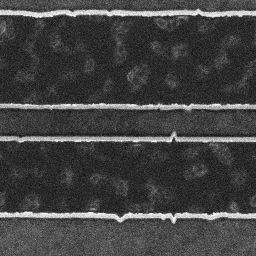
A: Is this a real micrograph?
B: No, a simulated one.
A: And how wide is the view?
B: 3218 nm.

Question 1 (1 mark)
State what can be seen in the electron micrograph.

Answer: one or a few lines or trenches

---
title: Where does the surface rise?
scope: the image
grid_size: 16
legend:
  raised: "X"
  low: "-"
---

----------------
XXXXXXXXXXXXXXXX
XXXXXXXXXXXXXXXX
XXXXXXXXXXXXXXXX
XXXXXXXXXXXXXXXX
XXXXXXXXXXXXXXXX
XXXXXXXXXXXXXXXX
----------------
----------------
XXXXXXXXXXXXXXXX
XXXXXXXXXXXXXXXX
XXXXXXXXXXXXXXXX
XXXXXXXXXXXXXXXX
-----XXXXXX-XX--
----------------
----------------